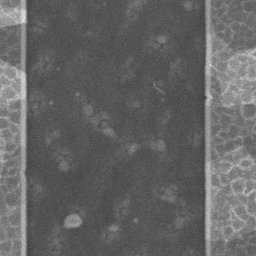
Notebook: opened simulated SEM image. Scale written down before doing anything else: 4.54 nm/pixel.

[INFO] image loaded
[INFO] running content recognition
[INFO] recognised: one or a few lines or trenches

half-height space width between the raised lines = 0.84 micrometres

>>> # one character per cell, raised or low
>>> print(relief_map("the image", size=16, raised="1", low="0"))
1000000000000111
1000000000000111
1000000000000111
1000000000000111
1000000000000111
1000000000000111
1000000000000111
1000000000000111
1000000000000111
1000000000000111
1000000000000111
1000000000000111
1000000000000111
1000000000000111
1000000000000111
1000000000000111